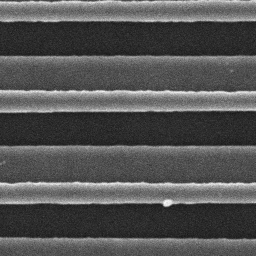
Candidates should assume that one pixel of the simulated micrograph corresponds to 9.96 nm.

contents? lines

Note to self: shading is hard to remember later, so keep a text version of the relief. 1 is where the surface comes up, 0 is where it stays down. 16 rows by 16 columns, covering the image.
1111111111111111
0000000000000000
0000000000000000
0000000000000000
1111111111111111
1111111111111111
1111111111111111
0000000000000000
0000000000000000
1111111111111111
1111111111111111
1111111111111111
1111111111111111
0000000000000000
0000000000000000
1111111111111111